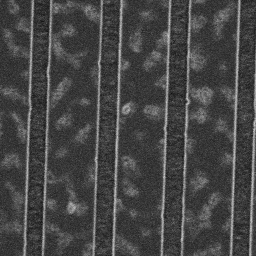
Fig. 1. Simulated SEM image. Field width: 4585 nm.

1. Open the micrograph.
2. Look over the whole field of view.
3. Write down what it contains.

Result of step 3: one or a few lines or trenches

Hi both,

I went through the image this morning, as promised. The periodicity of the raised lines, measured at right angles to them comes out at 1240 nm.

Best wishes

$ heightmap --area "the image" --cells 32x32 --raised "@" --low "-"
@@@@--@@@@@@@--@@@@@@---@@@@@@--
@@@@--@@@@@@@--@@@@@@---@@@@@@--
@@@@--@@@@@@@--@@@@@@---@@@@@@--
@@@@--@@@@@@@--@@@@@@---@@@@@@--
@@@@--@@@@@@@--@@@@@@---@@@@@@--
@@@@--@@@@@@@--@@@@@@---@@@@@@--
@@@@--@@@@@@@--@@@@@@---@@@@@@--
@@@@--@@@@@@---@@@@@@--@@@@@@@--
@@@@--@@@@@@---@@@@@@--@@@@@@@--
@@@@--@@@@@@---@@@@@@--@@@@@@@--
@@@@--@@@@@@---@@@@@@---@@@@@@--
@@@@--@@@@@@---@@@@@@--@@@@@@@--
@@@@--@@@@@@---@@@@@@--@@@@@@---
@@@@--@@@@@@---@@@@@@--@@@@@@---
@@@@--@@@@@@---@@@@@@--@@@@@@---
@@@@--@@@@@@---@@@@@@--@@@@@@---
@@@@--@@@@@@---@@@@@@--@@@@@@---
@@@@--@@@@@@---@@@@@@--@@@@@@---
@@@@--@@@@@@---@@@@@@--@@@@@@---
@@@---@@@@@@---@@@@@@--@@@@@@---
@@@---@@@@@@---@@@@@@--@@@@@@---
@@@---@@@@@@---@@@@@@--@@@@@@---
@@@---@@@@@@--@@@@@@@--@@@@@@---
@@@---@@@@@@--@@@@@@---@@@@@@---
@@@---@@@@@@--@@@@@@---@@@@@@---
@@@--@@@@@@@--@@@@@@---@@@@@@---
@@@--@@@@@@@--@@@@@@---@@@@@@--@
@@@--@@@@@@@--@@@@@@---@@@@@@--@
@@@--@@@@@@@--@@@@@@---@@@@@@--@
@@@--@@@@@@@--@@@@@@---@@@@@@--@
@@@--@@@@@@@--@@@@@@---@@@@@@--@
@@@--@@@@@@@--@@@@@@---@@@@@@--@